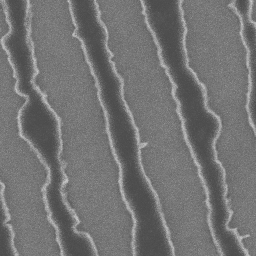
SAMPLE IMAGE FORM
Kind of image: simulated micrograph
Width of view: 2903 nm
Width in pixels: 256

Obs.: one or a few lines or trenches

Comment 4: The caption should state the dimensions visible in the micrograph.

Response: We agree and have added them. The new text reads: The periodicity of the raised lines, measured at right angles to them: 0.851 microns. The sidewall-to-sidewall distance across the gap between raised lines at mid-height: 528 nm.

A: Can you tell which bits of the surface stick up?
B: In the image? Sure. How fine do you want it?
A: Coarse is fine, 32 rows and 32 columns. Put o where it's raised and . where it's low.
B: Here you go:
oooo.....ooo......ooooo......oo.
.ooo.....ooo......ooooo......oo.
.ooo.....oooo.....ooooo.......oo
.ooo.....oooo......oooo.......oo
.ooo.....oooo......oooo.......oo
oooo......ooo.......ooo........o
.ooo.......ooo......ooo........o
.ooo.......ooo......oooo.......o
..ooo......ooo.......ooo.......o
..oo........ooo......oooo......o
..oo........ooo......oooo......o
..ooo.......ooo.......oooo.....o
...ooo......oooo......oooo.....o
...ooo.......ooo......oooo.....o
..ooooo......oooo.....ooooo....o
..ooooo......oooo......ooooo...o
..oooooo.....oooo......oooo.....
...ooooo......oooo.....oooo.....
....oooo......oooo......ooo.....
.....ooo......oooo......ooo.....
.....ooo.......ooo.......ooo....
......oo.......ooo.......ooo....
......oo.......oooo......ooo....
.....ooo.......oooo.......oo....
.....ooo.......ooooo......oo....
o.....oo........oooo......ooo...
o.....ooo.......oooo......ooo...
o.....oooo.......oooo.....ooo...
o......ooo.......oooo.....ooo...
oo.....oooo......oooo......ooo..
oo.....ooooo.....ooooo.....ooo..
oo......oooo.....ooooo.....oooo.